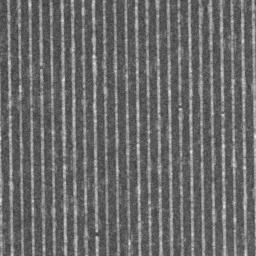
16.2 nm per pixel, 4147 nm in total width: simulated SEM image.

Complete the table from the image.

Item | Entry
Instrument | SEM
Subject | parallel lines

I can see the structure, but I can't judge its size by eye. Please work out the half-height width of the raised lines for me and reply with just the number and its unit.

0.0263 um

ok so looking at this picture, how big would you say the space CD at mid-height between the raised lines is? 8.75 px